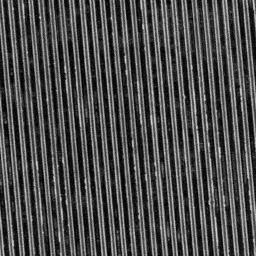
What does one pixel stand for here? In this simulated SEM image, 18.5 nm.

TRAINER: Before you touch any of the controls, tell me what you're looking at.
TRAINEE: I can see parallel lines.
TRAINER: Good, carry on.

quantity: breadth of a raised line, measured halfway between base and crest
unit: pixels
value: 3.74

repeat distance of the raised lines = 10.2 pixels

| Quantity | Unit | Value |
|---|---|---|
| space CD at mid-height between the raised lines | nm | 120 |